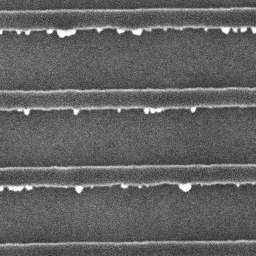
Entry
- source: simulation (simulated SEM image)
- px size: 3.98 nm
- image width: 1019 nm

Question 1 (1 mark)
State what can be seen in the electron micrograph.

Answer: lines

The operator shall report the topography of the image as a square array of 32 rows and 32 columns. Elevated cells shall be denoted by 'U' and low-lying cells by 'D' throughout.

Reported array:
DDDDDDDDDDDDDDDDDDDDDDDDDDDDDDDD
UUUUUUUUUUUUUUUUUUUUUUUUUUUUUUUU
UUUUUUUUUUUUUUUUUUUUUUUUUUUUUUUU
UUUUUUUUUUUUUDUUUUUDDDUDDUDUUUUU
DDDDDDDDDDDDDDDDDDDDDDDDDDDDDDDD
DDDDDDDDDDDDDDDDDDDDDDDDDDDDDDDD
DDDDDDDDDDDDDDDDDDDDDDDDDDDDDDDD
DDDDDDDDDDDDDDDDDDDDDDDDDDDDDDDD
DDDDDDDDDDDDDDDDDDDDDDDDDDDDDDDD
DDDDDDDDDDDDDDDDDDDDDDDDDDDDDDDD
DDDDDDDDDDDDDDDDDDDDDDDDDDDDDDDD
UUUUUUUUUUUUUUUUUUUUUUUUUUUUUUUU
UUUUUUUUUUUUUUUUUUUUUUUUUUUUUUUU
UUUUUUUUUUUUUUUUUDUUUDDUUDDDDDDD
DDDDDDDDDDDDDDDDDDDDDDDDDDDDDDDD
DDDDDDDDDDDDDDDDDDDDDDDDDDDDDDDD
DDDDDDDDDDDDDDDDDDDDDDDDDDDDDDDD
DDDDDDDDDDDDDDDDDDDDDDDDDDDDDDDD
DDDDDDDDDDDDDDDDDDDDDDDDDDDDDDDD
DDDDDDDDDDDDDDDDDDDDDDDDDDDDDDDD
DDDDDDDDDDDDDDDDDDDDDDDDDDDDDDDD
UUUUUUUUUUUUUUUUUUUUUUUUUUUUUUUU
UUUUUUUUUUUUUUUUUUUUUUUUUUUUUUUU
UUUDDDDDDUDDDDDDDDDDDDDUDDDDDDDD
DDDDDDDDDDDDDDDDDDDDDDDDDDDDDDDD
DDDDDDDDDDDDDDDDDDDDDDDDDDDDDDDD
DDDDDDDDDDDDDDDDDDDDDDDDDDDDDDDD
DDDDDDDDDDDDDDDDDDDDDDDDDDDDDDDD
DDDDDDDDDDDDDDDDDDDDDDDDDDDDDDDD
DDDDDDDDDDDDDDDDDDDDDDDDDDDDDDDD
UUUUUUUUUUUUUUUUUUUUUUUUUUUUUUUU
UUUUUUUUUUUUUUUUUUUUUUUUUUUUUUUU